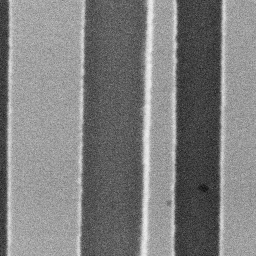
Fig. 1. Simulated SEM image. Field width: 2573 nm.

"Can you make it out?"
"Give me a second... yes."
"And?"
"lines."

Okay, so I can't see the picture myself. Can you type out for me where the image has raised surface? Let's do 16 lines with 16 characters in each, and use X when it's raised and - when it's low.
-XXXX----XX---XX
-XXXX----XX---XX
-XXXX----XX---XX
-XXXX----XX---XX
-XXXX----XX---XX
-XXXX----XX---XX
-XXXX----XX---XX
-XXXX----XX---XX
-XXXX----XX---XX
-XXXX----XX---XX
-XXXX----XX---XX
-XXXX----XX---XX
-XXXX----XX---XX
-XXXX----XX---XX
-XXXX----XX---XX
-XXXX----XX---XX